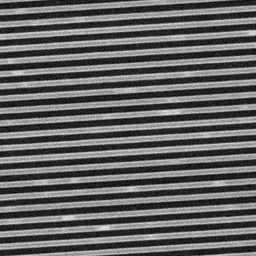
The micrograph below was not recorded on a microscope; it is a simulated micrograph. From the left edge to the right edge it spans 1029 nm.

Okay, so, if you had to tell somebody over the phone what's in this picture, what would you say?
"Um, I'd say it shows parallel lines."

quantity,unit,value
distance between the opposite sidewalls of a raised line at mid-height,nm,21.1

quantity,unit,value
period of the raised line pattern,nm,49.5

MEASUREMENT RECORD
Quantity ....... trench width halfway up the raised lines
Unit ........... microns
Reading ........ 0.0281